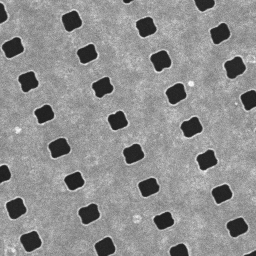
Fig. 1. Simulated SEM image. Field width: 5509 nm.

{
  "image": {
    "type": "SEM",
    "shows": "a regular array of holes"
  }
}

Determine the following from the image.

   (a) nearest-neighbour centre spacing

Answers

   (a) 785 nm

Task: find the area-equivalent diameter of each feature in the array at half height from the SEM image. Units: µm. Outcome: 0.425